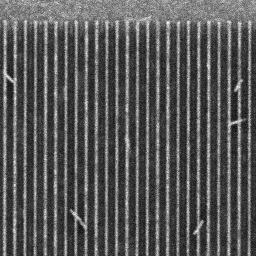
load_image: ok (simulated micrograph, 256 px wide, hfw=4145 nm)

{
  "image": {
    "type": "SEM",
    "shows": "parallel lines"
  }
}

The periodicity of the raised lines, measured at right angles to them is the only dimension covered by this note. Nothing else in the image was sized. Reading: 165 nanometers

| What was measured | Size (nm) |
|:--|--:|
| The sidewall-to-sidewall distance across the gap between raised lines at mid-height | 130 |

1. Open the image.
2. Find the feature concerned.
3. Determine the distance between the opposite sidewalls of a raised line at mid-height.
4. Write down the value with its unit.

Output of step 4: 2 pixels